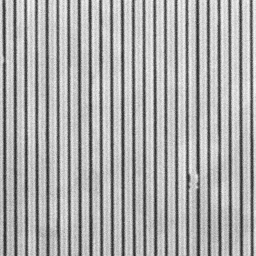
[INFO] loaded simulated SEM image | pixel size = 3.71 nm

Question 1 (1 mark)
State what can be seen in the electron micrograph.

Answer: parallel lines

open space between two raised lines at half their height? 14.4 nm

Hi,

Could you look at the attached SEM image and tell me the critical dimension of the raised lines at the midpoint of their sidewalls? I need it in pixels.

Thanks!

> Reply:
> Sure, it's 6.63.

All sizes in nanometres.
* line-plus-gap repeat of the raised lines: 40